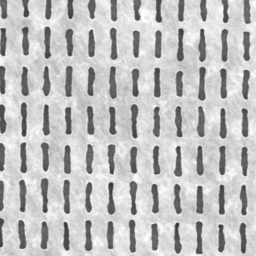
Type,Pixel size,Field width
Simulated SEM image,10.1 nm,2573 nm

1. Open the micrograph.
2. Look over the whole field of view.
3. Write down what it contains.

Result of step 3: a regular array of holes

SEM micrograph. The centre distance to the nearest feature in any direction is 221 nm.